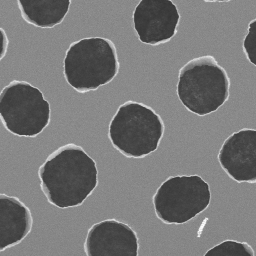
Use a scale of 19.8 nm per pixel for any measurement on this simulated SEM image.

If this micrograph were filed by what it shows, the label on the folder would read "holes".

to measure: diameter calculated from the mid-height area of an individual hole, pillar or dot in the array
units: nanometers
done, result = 1010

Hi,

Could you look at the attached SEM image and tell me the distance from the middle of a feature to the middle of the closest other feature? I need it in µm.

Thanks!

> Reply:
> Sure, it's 1.59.